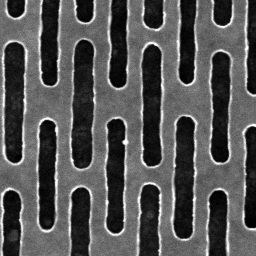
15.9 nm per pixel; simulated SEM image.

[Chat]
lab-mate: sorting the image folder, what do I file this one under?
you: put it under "holes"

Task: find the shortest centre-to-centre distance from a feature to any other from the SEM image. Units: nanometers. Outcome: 1090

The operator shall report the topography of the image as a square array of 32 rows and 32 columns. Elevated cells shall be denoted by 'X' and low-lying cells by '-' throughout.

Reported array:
X--XX---XX--XX--XX--XX---XX--XX-
X--XX--XX---XX--XX--XX---XX--XX-
XXXXX--XXX-XXX--XX--XXX-XXX--XX-
XXXXX--XXXXXXX--XXX-XXX-XXXXXXX-
XXXXX--XXXXXXX--XXXXXX--XXXXXXX-
X-XXX--XXX-XXX--XXXXXX--XXXXXXX-
---XX--XX---XX--XX--XX--XXX-XXX-
---XX--XX---XX--XX--XX--XX---XX-
X--XX--XX---XX--XX--XX--XX---XX-
X--XX--XX---XX--XX--XX--XX---XX-
X--XXX-XX---XX--XX--XXXXXX---XX-
X--XXXXXX---XXXXXX--XXXXXX---XX-
X--XXXXXX---XXXXXX--XXXXXXX--XXX
---XXXXXX---XXXXXX--XXXXXXX--XXX
---XXXXXX---XXXXXX--XXXXXXX--XXX
---XX--XX---X---XX--XX--XX---XXX
X--XX--XX--XX---XX--XX--XXX--XX-
X--XX--XX---XX--XX--XX--XX---XX-
X--XX--XX---XX--XX--XX--XX---XX-
X--XX--XX---X---XX--XX--XX---XX-
XXXXX--XX--XX---XX--XX--XXXXXXX-
XXXXX--XXXXXX---XXXXXX--XXXXXXX-
XXXXX--XXXXXX---XXXXXX--XXXXXXX-
XXXXX--XXXXXX---XX--XX--XXXXXXX-
--XXX--XX--XX--XXX--XX--XX--XXX-
---XX--XX--XX--XX---XX--XX--XXX-
---XX--XX--XX---XX--XX--XX--XX--
---XX--XX--XX--XX---XX--XX--XXX-
---XX-XXX--XX--XX---XX--XX--XXX-
---XXXXXX--XXXXXX---XX--XX--XXXX
---XXXXXX--XXXXXX---XXXXXX--XXXX
--XXXXXXX--XXXXXX---XXXXXX--XXXX